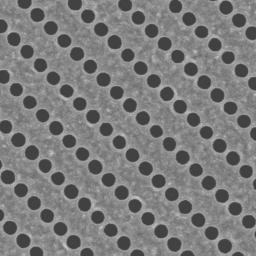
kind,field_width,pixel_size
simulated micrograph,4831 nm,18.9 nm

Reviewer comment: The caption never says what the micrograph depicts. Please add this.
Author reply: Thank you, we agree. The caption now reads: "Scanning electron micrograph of a regular array of holes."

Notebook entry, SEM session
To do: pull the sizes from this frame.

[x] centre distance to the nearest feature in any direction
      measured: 347 nm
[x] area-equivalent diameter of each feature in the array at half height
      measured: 0.266 µm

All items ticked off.